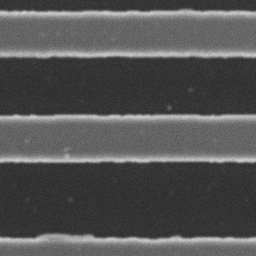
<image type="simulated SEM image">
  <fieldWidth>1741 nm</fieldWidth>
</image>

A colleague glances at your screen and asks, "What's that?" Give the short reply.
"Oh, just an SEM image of lines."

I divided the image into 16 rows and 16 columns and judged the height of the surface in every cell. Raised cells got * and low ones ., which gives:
................
****************
****************
..*..*........**
................
................
................
****************
****************
****************
................
................
................
................
................
****************